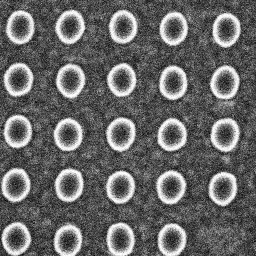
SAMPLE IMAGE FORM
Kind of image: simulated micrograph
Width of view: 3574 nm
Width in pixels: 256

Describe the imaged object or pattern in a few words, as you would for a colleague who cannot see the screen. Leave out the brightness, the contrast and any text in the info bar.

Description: a regular array of raised bodies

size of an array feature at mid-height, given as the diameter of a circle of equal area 391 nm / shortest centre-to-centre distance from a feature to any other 714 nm